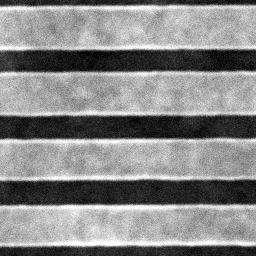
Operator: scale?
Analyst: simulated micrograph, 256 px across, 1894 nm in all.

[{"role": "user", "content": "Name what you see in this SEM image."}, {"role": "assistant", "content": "wiring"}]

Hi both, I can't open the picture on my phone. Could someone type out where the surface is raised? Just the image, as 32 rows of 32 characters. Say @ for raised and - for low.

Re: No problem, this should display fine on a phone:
--------------------------------
@@@@@@@@@@@@@@@@@@@@@@@@@@@@@@@@
@@@@@@@@@@@@@@@@@@@@@@@@@@@@@@@@
@@@@@@@@@@@@@@@@@@@@@@@@@@@@@@@@
@@@@@@@@@@@@@@@@@@@@@@@@@@@@@@@@
@@@@@@@@@@@@@@@@@@@@@@@@@@@@@@@@
--------------------------------
--------------------------------
--------------------------------
@@@@@@@@@@@@@@@@@@@@@@@@@@@@@@@@
@@@@@@@@@@@@@@@@@@@@@@@@@@@@@@@@
@@@@@@@@@@@@@@@@@@@@@@@@@@@@@@@@
@@@@@@@@@@@@@@@@@@@@@@@@@@@@@@@@
@@@@@@@@@@@@@@@@@@@@@@@@@@@@@@@@
--------------------------------
--------------------------------
--------------------------------
--------------------------@@@---
@@@@@@@@@@@@@@@@@@@@@@@@@@@@@@@@
@@@@@@@@@@@@@@@@@@@@@@@@@@@@@@@@
@@@@@@@@@@@@@@@@@@@@@@@@@@@@@@@@
@@@@@@@@@@@@@@@@@@@@@@@@@@@@@@@@
--------------------------------
--------------------------------
--------------------------------
--------------------------------
@@@@@@@@@@@@@@@@@@@@@@@@@@@@@@@@
@@@@@@@@@@@@@@@@@@@@@@@@@@@@@@@@
@@@@@@@@@@@@@@@@@@@@@@@@@@@@@@@@
@@@@@@@@@@@@@@@@@@@@@@@@@@@@@@@@
@@@@@@@@@@@@@@@@@@@@@@@@@@@@@@@@
--------------------------------